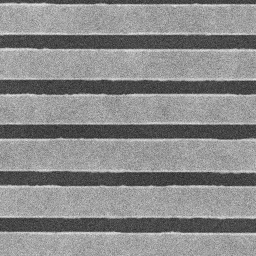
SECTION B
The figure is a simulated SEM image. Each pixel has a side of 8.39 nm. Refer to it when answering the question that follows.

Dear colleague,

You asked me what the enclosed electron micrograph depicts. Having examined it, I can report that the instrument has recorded lines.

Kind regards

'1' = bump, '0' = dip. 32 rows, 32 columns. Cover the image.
00000000000000000000000000000000
11111111111111111111111111111111
11111111111111111111111111111111
11111111111111111111111111111111
00000000000000000000000000000000
00000000000000000000000000000000
11111111111111111111111111111111
11111111111111111111111111111111
11111111111111111111111111111111
11111111111111111111111111111111
00000000000000000000000000000000
00000000000000000000000000000000
11111111111111111111111111111111
11111111111111111111111111111111
11111111111111111111111111111111
00000000000000000000000000000000
00000000000000000000000000000000
11111111111111111111111111110111
11111111111111111111111111111111
11111111111111111111111111111111
11111111111111111111111111111111
00000000000000000000000000000010
00000000000000000000000000000000
11111111111111111111111111111111
11111111111111111111111111111111
11111111111111111111111111111111
11111111111111111111111111111111
00000000000000000000000000000000
00000000000000000000000000000000
11111111111111111111111111111111
11111111111111111111111111111111
11111111111111111111111111111111